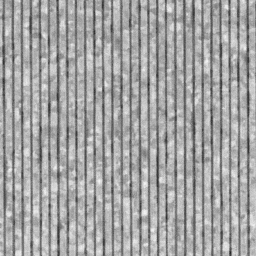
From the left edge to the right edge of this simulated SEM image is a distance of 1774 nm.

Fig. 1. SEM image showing parallel lines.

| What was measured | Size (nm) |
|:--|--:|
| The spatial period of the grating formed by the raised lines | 62.5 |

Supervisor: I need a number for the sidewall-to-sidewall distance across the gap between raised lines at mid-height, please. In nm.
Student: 19.9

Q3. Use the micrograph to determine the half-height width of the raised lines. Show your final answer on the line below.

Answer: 40.7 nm